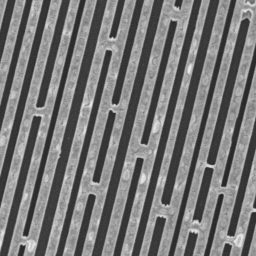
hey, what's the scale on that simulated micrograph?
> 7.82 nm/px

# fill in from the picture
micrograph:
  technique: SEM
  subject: parallel lines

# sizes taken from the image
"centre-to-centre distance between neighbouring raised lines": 141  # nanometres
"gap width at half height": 60.8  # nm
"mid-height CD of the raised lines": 0.0826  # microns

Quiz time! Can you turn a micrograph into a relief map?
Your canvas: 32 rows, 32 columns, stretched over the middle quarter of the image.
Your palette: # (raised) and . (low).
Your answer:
.###...##..###..##...###..##..##
.###...##..###..##...###.###..##
.###..###..##...##...##..###..##
.###..###..##..###..###..###..##
###...###.###..##...###..##..##.
###...##..###..##...###..##..##.
###..###..###..##...##..###..##.
###..###..##..###..###..###..##.
##...###.###..##...###..##..##..
##...##..###..##...###..##..##..
##..###..#######...##..###..##..
##..###..#######..###..###..##..
#...###.###..###..###..##...#...
#...##..###..##...##...##..##...
#..###..###..##...##..###..##...
...###..##..###..###..###..##..#
...###.###..###..###..##...#...#
...##..###..##...###..##..##...#
..###..###..##...##..###..##...#
..###..##..###..###..###..##..##
..###.###..###..########..#...##
..##..###..##...#######..##...##
.###..###..##...#######..##...##
.###..##..###..###.####..##..###
.###.###..###..###..###..##..###
.##..###..##...###..##..##...##.
###..###..##...###.###..##...##.
###..##..###..###..###..##..###.
###.###..###..###..###..##..###.
##..###..##...###..##..##...##..
##..#######...##..###..##...##..
##..#######..###..###..##..###..